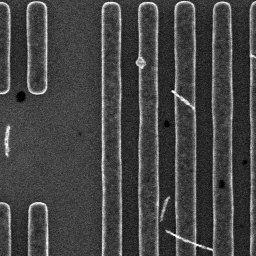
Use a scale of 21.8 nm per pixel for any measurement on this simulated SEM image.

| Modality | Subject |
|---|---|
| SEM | wiring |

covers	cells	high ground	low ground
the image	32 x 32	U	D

UDDDUDDDDDDDDUUDDDUDDDUUDDDUDDDD
UDDUUUDDDDDDDUUDDUUUDDUUDDDUUDDU
UDDUUUDDDDDDDUUDDUUUDDUUDDDUUDDU
UDDUUUDDDDDDDUUDDUUUDDUUDDDUUDDU
UDDUUUDDDDDDDUUDDUUUDDUUDDDUUDDU
UDDUUUDDDDDDDUUDDUUUDDUUDDDUUDDU
UDDDUUDDDDDDDUUDDUUUDDUUDDDUUDDU
UDDDUUDDDDDDDUUDDUUUDDUUDDDUUDDU
UDDDUUDDDDDDDUUDDUUUDDUUDDDUUDDU
UDDUUUDDDDDDDUUDDUUUDDUUDDDUUDDU
UDDUUUDDDDDDDUUDDUUUDDUUDDDUUDDU
UDDDUDDDDDDDDUUDDUUUDDUUDDDUUDDU
DDDDDDDDDDDDDUUDDUUUDDUUDDDUUDDU
DDDDDDDDDDDDDUUDDUUUDDUUDDDUUDDU
DDDDDDDDDDDDDUUDDDUUDDUUDDDUUDDU
DDDDDDDDDDDDDUUDDUUUDDUUDDDUUDDU
DDDDDDDDDDDDDUUDDUUUDDUUDDDUUDDU
DDDDDDDDDDDDDUUDDUUUDDUUDDDUUDDU
DDDDDDDDDDDDDUUDDUUUDDUUDDDUUDDU
DDDDDDDDDDDDDUUDDUUUDDUUDDDUUDDU
DDDDDDDDDDDDDUUDDUUUDDUUDDDUUDDU
DDDDDDDDDDDDDUUDDUUUDDUUDDDUUDDU
DDDDDDDDDDDDDUUDDUUUDDUUDDDUUDDU
DDDDDDDDDDDDDUUDDUUUDDUUDDDUUDDU
DDDDDDDDDDDDDUUDDUUUDDUUDDDUUDDU
UDDDUDDDDDDDDUUDDUUUDDUUDDDUUDDU
UDDDUUDDDDDDDUUDDUUUDDUUDDDUUDDU
UDDDUUDDDDDDDUUDDUUUDDUUDDDUUDDU
UDDDUUDDDDDDDUUDDUUUDDUUDDDUUDDU
UDDDUUDDDDDDDUUDDUUUDDUUDDDUUDDU
UDDDUUDDDDDDDUUDDUUUDDUUUDDUUDDU
UDDDUUDDDDDDDUUDDUUUDDUUDDDUUDDU